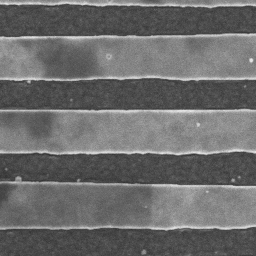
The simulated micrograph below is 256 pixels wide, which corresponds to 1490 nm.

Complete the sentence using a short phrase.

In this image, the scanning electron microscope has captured lines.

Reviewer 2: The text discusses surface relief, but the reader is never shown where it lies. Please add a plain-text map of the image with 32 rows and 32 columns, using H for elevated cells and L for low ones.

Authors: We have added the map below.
HHHHHHHHHHHHHHHHHHHHHHHHHHHHHHHH
LLLLLLLLLLLLLLLLLLLLLLLLLLLLLLLL
LLLLLLLLLLLLLLLLLLLLLLLLLLLLLLLL
LLLLLLLLLLLLLLLLLLLLLLLLLLLLLLLL
LLLLLLLLLLLLHHHLHLHHHHHHHHHHHHHH
HHHHHHHHHHHHHHHHHHHHHHHHHHHHHHHH
HHHHHHHHHHHHHHHHHHHHHHHHHHHHHHHH
HHHHHHHHHHHHHHHHHHHHHHHHHHHHHHHH
HHHHHHHHHHHHHHHHHHHHHHHHHHHHHHHH
HHHHHHHHHHHHHHHHHHHHHHHHHHHHHHHH
LLLLLLLLLLLLLLLLLLLLLLLLLLLLLLLL
LLLLLLLLLLLLLLLLLLLLLLLLLLLLLLLL
LLLLLLLLLLLLLLLLLLLLLLLLLLLLLLLL
LLLLLLLLLLLLLLLLLLLLLLLLLLLLLLLL
HHHHHHHHHHHHHHHHHHHHHHHHHHHHHHHH
HHHHHHHHHHHHHHHHHHHHHHHHHHHHHHHH
HHHHHHHHHHHHHHHHHHHHHHHHHHHHHHHH
HHHHHHHHHHHHHHHHHHHHHHHHHHHHHHHH
HHHHHHHHHHHHHHHHHHHHHHHHHHHHHHHH
LLLLLLLLLLLLLLLLLLLLLLLLLLLLLLLL
LLLLLLLLLLLLLLLLLLLLLLLLLLLLLLLL
LLLLLLLLLLLLLLLLLLLLLLLLLLLLLLLL
LLLLLLLLLLLLLLLLLLLLLLLLLLLLLLLL
HHHHHHHHHHHHHHHHHHHHHHHHHHHHHHHH
HHHHHHHHHHHHHHHHHHHHHHHHHHHHHHHH
HHHHHHHHHHHHHHHHHHHHHHHHHHHHHHHH
HHHHHHHHHHHHHHHHHHHHHHHHHHHHHHHH
HHHHHHHHHHHHHHHHHHHHHHHHHHHHHHHH
HHHHHHHHHHHHHLHHHHHHHHHHHHHHHHHL
LLLLLLLLLLLLLLLLLLLLLLLLLLLLLLLL
LLLLLLLLLLLLLLLLLLLLLLLLLLLLLLLL
LLLLLLLLLLLLLLLLLLLLLLLLLLLLLLLL